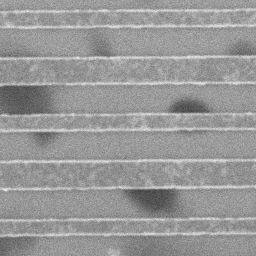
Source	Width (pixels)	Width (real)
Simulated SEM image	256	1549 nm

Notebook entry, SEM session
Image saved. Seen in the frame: lines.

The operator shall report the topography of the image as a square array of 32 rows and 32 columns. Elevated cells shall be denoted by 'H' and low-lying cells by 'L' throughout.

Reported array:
LLLLLLLLLLLLLLLLLLLLLLLLLLLLLLLL
LHHHHHHHHHHHHHHHHHHHHHHHHHHHHHHH
HHHHHHHHHHHHHHHHHHHHHHHHHHHHHHHH
LLLLLLLLLLLLLLLLLLLLLLLLLLLLLLLL
LLLLLLLLLLLLLLLLLLLLLLLLLLLLLLLL
LLLLLLLLLLLLLLLLLLLLLLLLLLLLLLLL
LLLLLLLLLLLLLLLLLLLLLLLLLLLLLLLL
HHHHHHHHHHHHHHHHHHHHHHHHHHHHHHHH
HHHHHHHHHHHHHHHHHHHHHHHHHHHHHHHH
HHHHHHHHHHHHHHHHHHHHHHHHHHHHHHHH
HHHHHHLLHHLLLLLLLLLLLLLLLLLLLLLL
LLLLLLLLLLLLLLLLLLLLLLLLLLLLLLLL
LLLLLLLLLLLLLLLLLLLLLLLLLLLLLLLL
LLLLLLLLLLLLLLLLLLLLLLLLLLLLLLLL
HHHHHHHHHHHHHHHHHHHHHHHHHHHHHHHH
HHHHHHHHHHHHHHHHHHHHHHHHHHHHHHHH
LLLLLLLLLLLLLLLLLLLLLLLLLLLLLLLL
LLLLLLLLLLLLLLLLLLLLLLLLLLLLLLLL
LLLLLLLLLLLLLLLLLLLLLLLLLLLLLLLL
LLLLLLLLLLLLLLLLLLLLLLLLLLLLLLLL
HHHHHHHHHHHHHHHHHHHHHHHHHHHHHHHH
HHHHHHHHHHHHHHHHHHHHHHHHHHHHHHHH
HHHHHHHHHHHHHHHHHHHHHHHHHHHHHHHH
HHHHHHHHHHHHHHHHHHHHHHHLLLLLLLLL
LLLLLLLLLLLLLLLLLLLLLLLLLLLLLLLL
LLLLLLLLLLLLLLLLLLLLLLLLLLLLLLLL
LLLLLLLLLLLLLLLLLLLLLLLLLLLLLLLL
LLLLLLLLHHHHHHHHHHHHHHHHHHHHHHHH
HHHHHHHHHHHHHHHHHHHHHHHHHHHHHHHH
LLLLLLLLLLLLLLLLLLLLLLLLLLLLLLLL
LLLLLLLLLLLLLLLLLLLLLLLLLLLLLLLL
LLLLLLLLLLLLLLLLLLLLLLLLLLLLLLLL